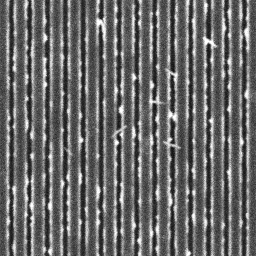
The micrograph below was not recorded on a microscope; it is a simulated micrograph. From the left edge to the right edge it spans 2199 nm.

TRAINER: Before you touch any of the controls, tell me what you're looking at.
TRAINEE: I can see parallel lines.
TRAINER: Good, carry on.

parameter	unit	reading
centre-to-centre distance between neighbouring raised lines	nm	154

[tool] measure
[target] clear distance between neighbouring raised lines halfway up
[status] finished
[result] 0.044 µm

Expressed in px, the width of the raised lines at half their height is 12.7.